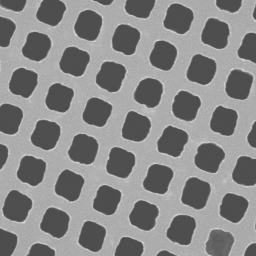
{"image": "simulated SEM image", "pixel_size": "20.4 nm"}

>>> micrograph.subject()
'a regular array of holes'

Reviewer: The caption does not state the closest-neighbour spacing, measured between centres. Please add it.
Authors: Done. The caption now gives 794 nm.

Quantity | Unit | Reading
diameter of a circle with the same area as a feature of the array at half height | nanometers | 590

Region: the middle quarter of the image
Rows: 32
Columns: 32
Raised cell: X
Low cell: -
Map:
------XXX------XXXXXXX-----XXXX-
-----XXXX------XXXXXXXXXX-XXXXX-
X----XXX-------XXXXXXXXXXXXXXXX-
XXXXXXXX-------XXXXXXXXXXXXXXXX-
XXXXXXXX------XXXXX-----XXXXXXXX
XXXXXXXXX-----XXXX-------XXXXXXX
--XXXXXXXX----XXXX-------XXXXXXX
--XXXXXXXXXXXXXXXX-------XXX----
--XXXXX-XXXXXXXXXX------XXXX----
--XXXX-----XXXXXXX------XXX-----
--XXX-------XXXXXXXXX--XXXX-----
-XXXX-------XXXXXXXXXXXXXXX-----
XXXXX-------XXXX---XXXXXXXX-----
XXXXX------XXXXX-----XXXXXXXX---
XXXXX------XXXX-------XXXXXXXXXX
XXXXXXXX--XXXXX-------XXXX-XXXXX
XXXXXXXXXXXXXX-------XXXX-----XX
XXXX-XXXXXXXXXX------XXX-------X
XX-----XXXXXXXX-----XXXX-------X
XX------XXXXXXXXXXXXXXX--------X
XX-------XXXXXXXXXXXXXX-------XX
X-------XXXX----XXXXXXXX------XX
X-------XXX------XXXXXXXXX---XXX
XX------XXX-------XXXXXXXXXXXXXX
XXXX---XXXX-------XXXXXXXXXXXXXX
XXXXXXXXXXX------XXXXX---XXXXXXX
-XXXXXXXXXX------XXXX------XXXXX
---XXXXXXXX-----XXXXX------XXXXX
-----XXXXXXXXXXXXXXX-------XXXXX
-----XXXXXXXXXXXXXXX------XXXXX-
-----XXXX--XXXXXXXXX------XXXX--
----XXXXX-----XXXXXXX-----XXXX--